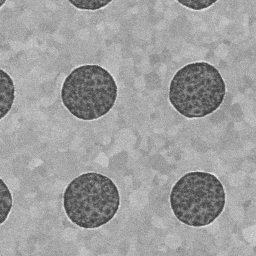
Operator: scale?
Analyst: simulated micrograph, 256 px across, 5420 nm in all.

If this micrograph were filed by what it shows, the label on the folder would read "holes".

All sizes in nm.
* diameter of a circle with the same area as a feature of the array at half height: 1180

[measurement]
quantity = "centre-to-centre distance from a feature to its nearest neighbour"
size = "2270 nanometers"